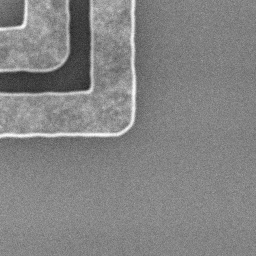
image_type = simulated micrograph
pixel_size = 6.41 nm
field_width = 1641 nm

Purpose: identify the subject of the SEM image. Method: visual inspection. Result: groups of lines, slits or small figures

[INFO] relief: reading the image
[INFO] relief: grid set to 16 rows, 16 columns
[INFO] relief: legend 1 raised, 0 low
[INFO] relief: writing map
0011001100000000
0111001100000000
1111001100000000
1111001100000000
0000001100000000
0000001100000000
1111111100000000
1111111100000000
0000000000000000
0000000000000000
0000000000000000
0000000000000000
0000000000000000
0000000000000000
0000000000000000
0000000000000000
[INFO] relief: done